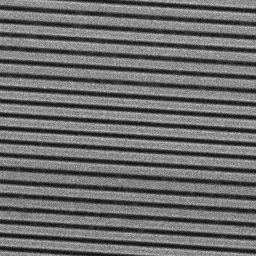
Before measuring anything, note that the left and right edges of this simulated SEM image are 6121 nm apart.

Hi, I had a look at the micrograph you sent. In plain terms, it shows parallel lines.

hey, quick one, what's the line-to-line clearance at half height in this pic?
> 128 nanometers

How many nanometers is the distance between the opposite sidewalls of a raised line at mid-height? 191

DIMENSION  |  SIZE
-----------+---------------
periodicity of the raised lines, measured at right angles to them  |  319 nanometres